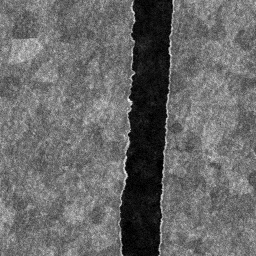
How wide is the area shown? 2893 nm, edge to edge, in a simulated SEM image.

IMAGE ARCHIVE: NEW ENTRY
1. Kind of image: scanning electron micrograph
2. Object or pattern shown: one or a few lines or trenches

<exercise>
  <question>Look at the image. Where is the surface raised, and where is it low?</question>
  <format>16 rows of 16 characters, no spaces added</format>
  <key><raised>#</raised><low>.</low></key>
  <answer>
########...#####
########...#####
########...#####
########...#####
########...#####
########...#####
########..######
########..######
########..######
########..######
########..######
########..######
########..######
########..######
########..######
########..######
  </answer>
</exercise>